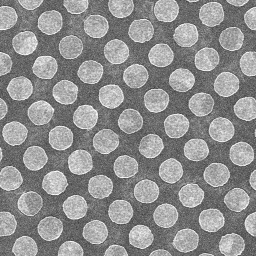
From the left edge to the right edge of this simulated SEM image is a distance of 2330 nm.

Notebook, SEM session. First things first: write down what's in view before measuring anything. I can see a regular array of raised bodies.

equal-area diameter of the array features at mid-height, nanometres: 219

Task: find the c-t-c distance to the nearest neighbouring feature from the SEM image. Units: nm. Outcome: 289